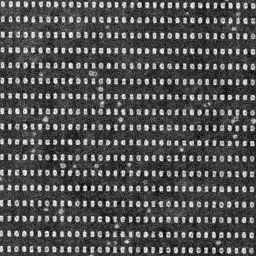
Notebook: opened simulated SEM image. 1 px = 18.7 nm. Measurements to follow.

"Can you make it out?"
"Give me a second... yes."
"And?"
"a regular array of raised bodies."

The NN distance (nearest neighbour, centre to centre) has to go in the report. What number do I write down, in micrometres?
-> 0.14